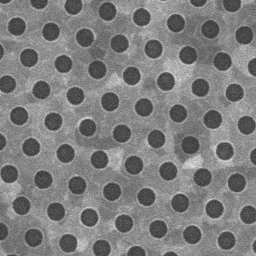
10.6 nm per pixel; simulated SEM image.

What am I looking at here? a regular array of holes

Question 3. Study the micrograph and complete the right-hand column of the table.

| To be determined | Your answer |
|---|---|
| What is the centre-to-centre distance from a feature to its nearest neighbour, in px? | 33.9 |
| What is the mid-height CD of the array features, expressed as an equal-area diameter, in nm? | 203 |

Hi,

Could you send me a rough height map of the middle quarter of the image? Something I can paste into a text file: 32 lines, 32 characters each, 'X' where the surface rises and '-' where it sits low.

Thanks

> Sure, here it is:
--XXXX----XXXXXXXXXXXXXXXXXXXXXX
--XXXX-----XXXX----XXXXXXXXXXXXX
XXXXXX-----XXXX----XXXXX---XXXXX
XXXXXXX---XXXXX----XXXX-----XXXX
XXXXXXXXXXXXXXX----XXXX-----XXXX
XXXXXXXXXXXXXXXXXXXXXXX-----XXXX
X----XXXXXXXXXXXXXXXXXXX--XXXXXX
X----XXXXX---XXXXXXXXXXXXXXXXXXX
X----XXXX-----XXXXXX-XXXXXXXXXXX
X----XXXX-----XXXX----XXXXXXXXXX
XXXXXXXXX-----XXXX----XXXXX---XX
XXXXXXXXXX---XXXXX----XXXX-----X
XXXXXXXXXXXXXXXXXX----XXXX-----X
XXXXXXXXXXXXXXXXXXXXXXXXXX-----X
XXXX----XXXXXXXXXXXXXXXXXXXX--XX
XXXX----XXXXX---XXXXXXXXXXXXXXXX
XXXX----XXXX-----XXXXX--XXXXXXXX
XXXX----XXXX-----XXXX----XXXXXXX
XXXXXXXXXXXX----XXXXX----XXXXX--
XXXXXXXXXXXXX---XXXXX----XXXX---
--XXXXXXXXXXXXXXXXXXXX---XXXX---
---XXXXXXXXXXXXXXXXXXXXXXXXXXX--
---XXXX----XXXXXXXXXXXXXXXXXXXX-
---XXX-----XXXXX---XXXXXXXXXXXXX
--XXXXX----XXXX-----XXXXX--XXXXX
XXXXXXX----XXXX-----XXXX----XXXX
XXXXXXXXXXXXXXX-----XXXX----XXXX
XXXXXXXXXXXXXXXX---XXXXX----XXXX
XX---XXXXXXXXXXXXXXXXXXX----XXXX
X-----XXXXXXXXXXXXXXXXXXXXXXXXXX
X-----XXXX----XXXXXXXXXXXXXXXXXX
X----XXXXX----XXXXX---XXXXXXXXXX